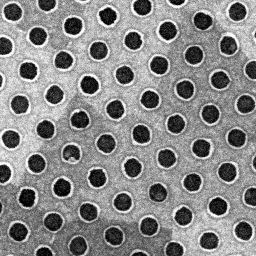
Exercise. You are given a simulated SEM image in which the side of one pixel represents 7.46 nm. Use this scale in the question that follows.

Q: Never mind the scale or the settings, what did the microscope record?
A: a regular array of holes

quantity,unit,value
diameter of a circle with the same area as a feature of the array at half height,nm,145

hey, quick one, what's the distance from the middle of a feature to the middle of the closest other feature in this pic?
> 35.1 px